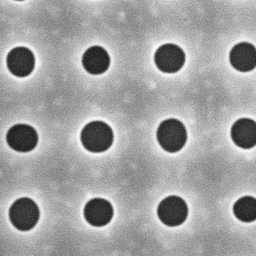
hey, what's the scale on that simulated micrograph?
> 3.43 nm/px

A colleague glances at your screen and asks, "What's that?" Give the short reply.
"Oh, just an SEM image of a regular array of holes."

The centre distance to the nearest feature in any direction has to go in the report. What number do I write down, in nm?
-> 255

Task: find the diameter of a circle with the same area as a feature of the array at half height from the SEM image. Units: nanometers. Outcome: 112